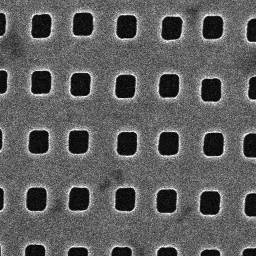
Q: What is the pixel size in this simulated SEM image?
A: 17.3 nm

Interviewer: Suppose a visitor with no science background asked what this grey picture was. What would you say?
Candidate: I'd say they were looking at a regular array of holes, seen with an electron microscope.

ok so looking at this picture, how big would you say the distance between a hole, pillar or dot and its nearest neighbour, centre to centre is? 41.7 pixels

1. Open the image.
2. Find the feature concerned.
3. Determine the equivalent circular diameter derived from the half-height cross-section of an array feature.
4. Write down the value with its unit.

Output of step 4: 408 nm